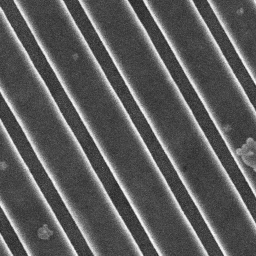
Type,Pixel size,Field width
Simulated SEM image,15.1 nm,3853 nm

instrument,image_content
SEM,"lines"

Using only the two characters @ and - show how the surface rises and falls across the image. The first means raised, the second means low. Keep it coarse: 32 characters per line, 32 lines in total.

--@@@@@@--@@@@@@--@@@@@@--@@@@@@
---@@@@@@--@@@@@@--@@@@@@--@@@@@
@--@@@@@@--@@@@@@--@@@@@@--@@@@@
@---@@@@@@--@@@@@@--@@@@@@--@@@@
@@--@@@@@@--@@@@@@@--@@@@@---@@@
@@@--@@@@@@--@@@@@@--@@@@@@--@@@
@@@--@@@@@@---@@@@@@--@@@@@@--@@
@@@@--@@@@@@--@@@@@@--@@@@@@--@@
@@@@---@@@@@@--@@@@@@--@@@@@@--@
@@@@@--@@@@@@--@@@@@@--@@@@@@--@
@@@@@@--@@@@@@--@@@@@@--@@@@@@--
@@@@@@--@@@@@@--@@@@@@---@@@@@@-
-@@@@@@--@@@@@@--@@@@@@--@@@@@@-
-@@@@@@--@@@@@@@--@@@@@@--@@@@@@
--@@@@@@--@@@@@@--@@@@@@--@@@@@@
--@@@@@@---@@@@@@--@@@@@@--@@@@@
@--@@@@@@--@@@@@@--@@@@@@--@@@@@
@---@@@@@@--@@@@@@--@@@@@@--@@@@
@@--@@@@@@--@@@@@@--@@@@@@---@@@
@@@--@@@@@@--@@@@@@--@@@@@@--@@@
@@@--@@@@@@--@@@@@@---@@@@@@--@@
@@@@--@@@@@@--@@@@@@--@@@@@@--@@
@@@@--@@@@@@---@@@@@@--@@@@@@--@
@@@@@--@@@@@@--@@@@@@--@@@@@@--@
@@@@@---@@@@@---@@@@@@--@@@@@@--
@@@@@@--@@@@@@--@@@@@@--@@@@@@@-
-@@@@@@--@@@@@@--@@@@@@--@@@@@@-
-@@@@@@--@@@@@@--@@@@@@---@@@@@@
--@@@@@@--@@@@@@--@@@@@@--@@@@@@
--@@@@@@---@@@@@---@@@@@@--@@@@@
@--@@@@@@--@@@@@@--@@@@@@--@@@@@
@--@@@@@@---@@@@@@--@@@@@@--@@@@